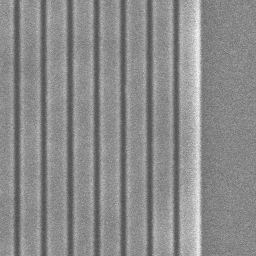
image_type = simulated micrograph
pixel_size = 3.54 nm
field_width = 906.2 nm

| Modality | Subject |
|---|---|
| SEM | parallel lines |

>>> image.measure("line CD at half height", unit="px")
19.2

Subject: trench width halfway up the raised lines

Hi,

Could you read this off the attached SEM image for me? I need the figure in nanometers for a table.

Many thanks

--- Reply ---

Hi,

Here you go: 24.8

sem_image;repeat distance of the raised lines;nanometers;93.8